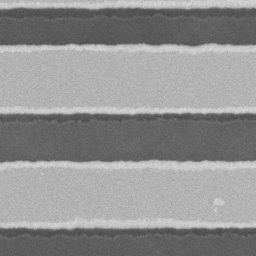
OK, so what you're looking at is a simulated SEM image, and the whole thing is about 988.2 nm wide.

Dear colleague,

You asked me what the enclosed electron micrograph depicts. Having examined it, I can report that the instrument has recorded lines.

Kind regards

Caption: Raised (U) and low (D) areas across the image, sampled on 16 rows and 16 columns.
UDUDUUUDDUUUUDDD
DDDDDDDDDDDDDDDD
DDDDDDDDDDDDDDDD
UUUUUUUUUUUUUUUU
UUUUUUUUUUUUUUUU
UUUUUUUUUUUUUUUU
UUUUUUUUUUUUUUUU
DDDDDDDDDDDDDDDD
DDDDDDDDDDDDDDDD
DDDDDDDDDDDDDDDD
UUUUUUUUUUUUUUUU
UUUUUUUUUUUUUUUU
UUUUUUUUUUUUUUUU
UUUUUUUUUUUUUUUU
DDDDDDDDDDDDDDDD
DDDDDDDDDDDDDDDD